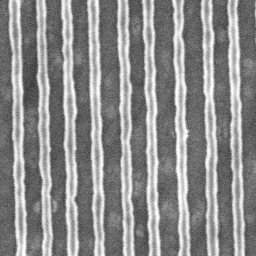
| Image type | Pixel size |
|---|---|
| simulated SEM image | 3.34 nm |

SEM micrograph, parallel lines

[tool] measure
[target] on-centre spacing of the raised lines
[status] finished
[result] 91.1 nm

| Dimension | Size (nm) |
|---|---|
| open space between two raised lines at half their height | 61.8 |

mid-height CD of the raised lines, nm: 28.8